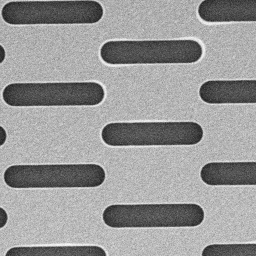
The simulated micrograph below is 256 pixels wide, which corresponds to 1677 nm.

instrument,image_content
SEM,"groups of lines, slits or small figures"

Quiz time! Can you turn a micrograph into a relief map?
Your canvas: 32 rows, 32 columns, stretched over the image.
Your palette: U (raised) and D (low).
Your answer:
UDDDDDDDDDDDUUUUUUUUUUUUUDDDDDDD
DDDDDDDDDDDDDUUUUUUUUUUUUDDDDDDD
UDDDDDDDDDDDUUUUUUUUUUUUUDDDDDDD
UUUUUUUUUUUUUUUUUUUUUUUUUUUUUUUU
UUUUUUUUUUUUUUUUUUUUUUUUUUUUUUUU
UUUUUUUUUUUUUDDDDDDDDDDDDUUUUUUU
DUUUUUUUUUUUUDDDDDDDDDDDDUUUUUUU
UUUUUUUUUUUUUDDDDDDDDDDDDUUUUUUU
UUUUUUUUUUUUUUUUUUUUUUUUUUUUUUUU
UUUUUUUUUUUUUUUUUUUUUUUUUUUUUUUU
UDDDDDDDDDDDUUUUUUUUUUUUUDDDDDDD
DDDDDDDDDDDDDUUUUUUUUUUUUDDDDDDD
DDDDDDDDDDDDDUUUUUUUUUUUUDDDDDDD
UUUUUUUUUUUUUUUUUUUUUUUUUUUUUUUU
UUUUUUUUUUUUUUUUUUUUUUUUUUUUUUUU
UUUUUUUUUUUUUDDDDDDDDDDDDUUUUUUU
DUUUUUUUUUUUUDDDDDDDDDDDDUUUUUUU
DUUUUUUUUUUUUDDDDDDDDDDDDUUUUUUU
UUUUUUUUUUUUUUUUUUUUUUUUUUUUUUUU
UUUUUUUUUUUUUUUUUUUUUUUUUUUUUUUU
UUUUUUUUDDDDUUUUUUUUUUUUUUDDDDDD
UDDDDDDDDDDDDUUUUUUUUUUUUDDDDDDD
UDDDDDDDDDDDDUUUUUUUUUUUUDDDDDDD
UUDDDDDDDUUUUUUUUUUUUUUUUUUUUUUU
UUUUUUUUUUUUUUUUUUUUUUUUUUUUUUUU
UUUUUUUUUUUUUUDDDDDDDDDDUUUUUUUU
DUUUUUUUUUUUUDDDDDDDDDDDDUUUUUUU
DUUUUUUUUUUUUDDDDDDDDDDDDUUUUUUU
UUUUUUUUUUUUUUDDDDDDUUUUUUUUUUUU
UUUUUUUUUUUUUUUUUUUUUUUUUUUUUUUU
UUUUUUUUUUUUUUUUUUUUUUUUUUUDDDDD
UDDDDDDDDDDDDUUUUUUUUUUUUDDDDDDD